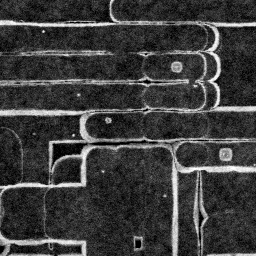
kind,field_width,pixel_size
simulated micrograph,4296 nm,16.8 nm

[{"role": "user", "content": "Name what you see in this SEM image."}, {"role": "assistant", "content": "wiring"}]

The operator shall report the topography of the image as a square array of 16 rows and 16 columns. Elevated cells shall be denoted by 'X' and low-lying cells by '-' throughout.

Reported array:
-------XXXXXXXXX
XX----XXXXXXXXXX
XXXXXXXXXXXXXX--
XXXXXXXXXXXXX---
XXXXXXXXXXXXXX--
XXXXXXXXXXXXXX--
XXXXXXXXXXXXXX--
-----XXXXXXXXXXX
-----XXXXXXXXXXX
-----XXXXXXXXXXX
-----XXXXXXXXXXX
-----XXXXXX-----
XXXXXXXXXXX-----
XXXXXXXXXXX-----
XXXXXXXXXXX-----
-----XXXXXX-----